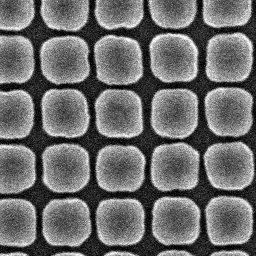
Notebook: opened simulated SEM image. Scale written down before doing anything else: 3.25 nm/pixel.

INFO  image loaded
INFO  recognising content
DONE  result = a regular array of raised bodies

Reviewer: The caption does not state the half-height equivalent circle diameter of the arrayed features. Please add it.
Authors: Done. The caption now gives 162 nm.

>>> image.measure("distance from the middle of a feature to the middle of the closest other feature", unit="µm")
0.174